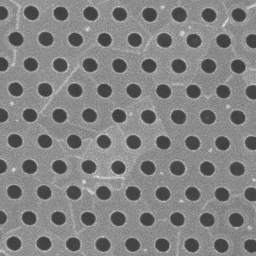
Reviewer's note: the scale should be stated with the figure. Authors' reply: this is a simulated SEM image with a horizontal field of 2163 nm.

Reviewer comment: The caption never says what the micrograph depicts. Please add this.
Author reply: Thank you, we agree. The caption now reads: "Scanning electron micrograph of a regular array of holes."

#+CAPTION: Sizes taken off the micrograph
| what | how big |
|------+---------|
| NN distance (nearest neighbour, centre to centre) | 0.245 microns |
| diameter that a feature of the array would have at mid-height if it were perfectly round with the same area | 124 nm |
